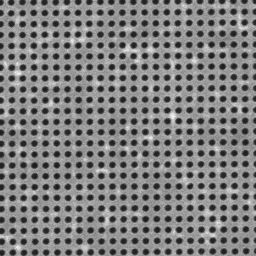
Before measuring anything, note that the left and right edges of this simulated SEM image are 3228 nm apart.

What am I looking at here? a regular array of holes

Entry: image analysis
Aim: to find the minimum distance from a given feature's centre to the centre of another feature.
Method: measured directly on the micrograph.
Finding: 134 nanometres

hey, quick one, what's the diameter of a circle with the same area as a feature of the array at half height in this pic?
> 84.1 nm